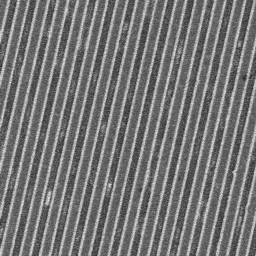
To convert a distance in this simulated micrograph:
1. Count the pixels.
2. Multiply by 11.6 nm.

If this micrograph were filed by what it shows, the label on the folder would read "parallel lines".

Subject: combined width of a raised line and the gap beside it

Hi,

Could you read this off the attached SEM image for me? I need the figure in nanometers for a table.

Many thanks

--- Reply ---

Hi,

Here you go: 222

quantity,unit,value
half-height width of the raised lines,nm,113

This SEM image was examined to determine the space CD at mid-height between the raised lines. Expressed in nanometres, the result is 103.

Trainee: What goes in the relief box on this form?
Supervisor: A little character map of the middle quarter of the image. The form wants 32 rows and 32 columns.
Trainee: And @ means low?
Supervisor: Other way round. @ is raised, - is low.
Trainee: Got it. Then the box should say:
@@---@@---@@---@@--@@@--@@@--@@@
@@--@@@--@@@--@@@--@@@--@@---@@-
@@--@@@--@@@--@@---@@---@@---@@-
@@--@@@--@@---@@---@@---@@---@@-
@---@@---@@---@@--@@@--@@@--@@@-
@---@@--@@@--@@@--@@@--@@@--@@@-
@--@@@--@@@--@@@--@@---@@---@@--
@--@@@--@@@--@@---@@---@@--@@@--
---@@---@@---@@--@@@--@@@--@@@--
---@@---@@---@@--@@@--@@@--@@@--
---@@--@@@--@@@--@@@--@@---@@---
--@@@--@@---@@@--@@---@@---@@---
--@@---@@---@@---@@---@@--@@@--@
--@@---@@---@@--@@@--@@@--@@@--@
--@@--@@@--@@@--@@@--@@@--@@@--@
-@@@--@@@--@@@--@@@--@@---@@---@
-@@@--@@@--@@---@@---@@--@@@--@@
-@@---@@---@@--@@@--@@@--@@@--@@
@@@--@@@--@@@--@@@--@@@--@@@--@@
@@@--@@@--@@@--@@@--@@---@@---@@
@@@--@@@--@@---@@---@@---@@---@@
@@---@@---@@---@@---@@--@@@--@@@
@@---@@---@@--@@@--@@@--@@@--@@@
@@--@@@--@@@--@@@--@@@--@@@--@@-
@@--@@@--@@@--@@@--@@---@@---@@-
@@--@@---@@---@@---@@--@@@--@@@-
@---@@---@@--@@@--@@@--@@@--@@@-
@--@@@--@@@--@@@--@@@--@@@--@@@-
@--@@@--@@@--@@---@@---@@---@@--
@--@@---@@---@@---@@---@@---@@--
---@@---@@---@@---@@--@@@--@@@--
---@@---@@--@@@--@@@--@@@--@@@--